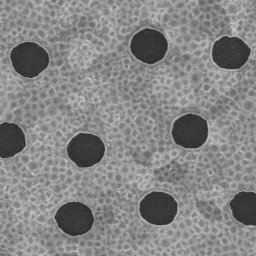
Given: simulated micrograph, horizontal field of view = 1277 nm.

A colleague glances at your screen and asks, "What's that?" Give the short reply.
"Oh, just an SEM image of holes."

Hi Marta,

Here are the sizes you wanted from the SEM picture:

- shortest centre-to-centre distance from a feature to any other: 0.408 micrometres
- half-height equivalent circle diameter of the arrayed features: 186 nanometers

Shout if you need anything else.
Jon